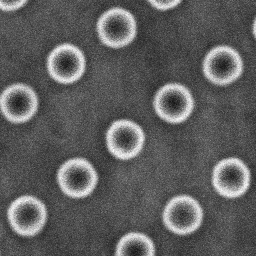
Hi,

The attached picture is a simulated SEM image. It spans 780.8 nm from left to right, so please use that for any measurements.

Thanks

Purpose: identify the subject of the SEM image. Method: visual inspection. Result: a regular array of raised bodies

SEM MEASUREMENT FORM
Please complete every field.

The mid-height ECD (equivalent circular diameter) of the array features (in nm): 111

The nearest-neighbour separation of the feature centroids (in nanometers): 187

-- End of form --